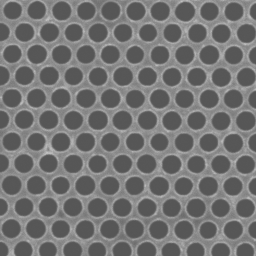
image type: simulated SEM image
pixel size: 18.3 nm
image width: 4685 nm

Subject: a regular array of holes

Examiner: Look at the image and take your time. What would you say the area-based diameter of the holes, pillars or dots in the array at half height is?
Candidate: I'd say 341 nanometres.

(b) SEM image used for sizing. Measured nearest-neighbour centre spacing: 446 nm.